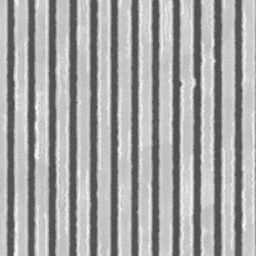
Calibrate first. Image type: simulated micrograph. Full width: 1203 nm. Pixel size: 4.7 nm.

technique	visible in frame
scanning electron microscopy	parallel lines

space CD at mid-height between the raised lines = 40 nm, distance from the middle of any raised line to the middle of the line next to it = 97.3 nm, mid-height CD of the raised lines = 57.6 nm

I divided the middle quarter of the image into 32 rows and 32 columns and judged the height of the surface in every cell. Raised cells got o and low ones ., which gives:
o...oo...oo...oo...ooo..ooo..ooo
o...oo...oo...oo...ooo..ooo..ooo
o...oo..ooo...oo...ooo..ooo..ooo
o...oo...oo...oo...ooo..ooo..ooo
o...oo...oo...oo...ooo..ooo..ooo
o...oo...oo...oo...ooo..ooo...oo
o...oo...oo...oo...ooo..ooo..ooo
o...oo...oo...oo...ooo..ooo..ooo
o...oo...oo...ooo..ooo..ooo..ooo
o...oo...oo...ooo..ooo..ooo..ooo
o...oo...oo...ooo..ooo..ooo..ooo
o...oo...oo...ooo..ooo..ooo..ooo
o..ooo..ooo...ooo..ooo..ooo..ooo
o..ooo...oo...oo...ooo..ooo..ooo
o..ooo...oo...ooo..ooo..ooo..ooo
o..ooo...oo...oo...ooo..ooo..ooo
o..ooo...oo...oo...ooo..ooo..ooo
o..ooo...oo...oo...ooo..ooo..ooo
o..ooo...oo...ooo..ooo..ooo..ooo
o..ooo...oo...ooo..ooo..ooo..ooo
o..ooo...oo...ooo..ooo..ooo..ooo
o..ooo...oo...ooo..ooo..ooo..ooo
o..ooo...oo...ooo..ooo..ooo..ooo
o..ooo...oo...oo...ooo..ooo..ooo
o..ooo...oo...ooo..ooo..ooo..ooo
o..ooo...oo...ooo..ooo..ooo..ooo
o..ooo...oo...oo...ooo..ooo..ooo
o..ooo...oo...ooo..ooo..ooo..ooo
o..ooo..ooo...oo...ooo..ooo..ooo
o..ooo..ooo...ooo..ooo..ooo..ooo
o..ooo...oo...ooo..ooo..ooo..ooo
o..ooo...oo...ooo..ooo..ooo..ooo